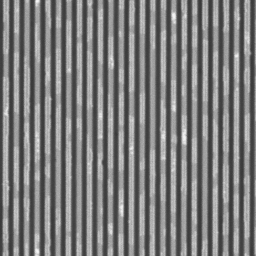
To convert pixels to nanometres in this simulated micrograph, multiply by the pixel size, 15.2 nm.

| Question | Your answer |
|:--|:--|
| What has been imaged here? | parallel lines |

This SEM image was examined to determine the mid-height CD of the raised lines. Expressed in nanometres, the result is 76.2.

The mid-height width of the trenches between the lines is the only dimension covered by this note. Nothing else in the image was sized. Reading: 76.2 nm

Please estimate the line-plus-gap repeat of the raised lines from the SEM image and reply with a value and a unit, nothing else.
160 nm